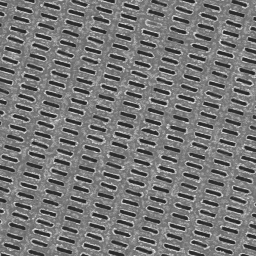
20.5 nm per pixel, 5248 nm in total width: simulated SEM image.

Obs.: a regular array of holes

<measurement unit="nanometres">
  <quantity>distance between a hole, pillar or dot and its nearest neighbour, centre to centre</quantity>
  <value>209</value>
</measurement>